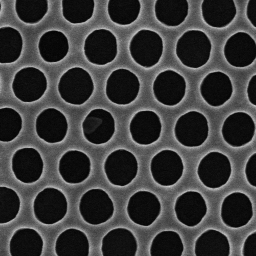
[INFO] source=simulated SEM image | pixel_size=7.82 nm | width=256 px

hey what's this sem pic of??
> a regular array of holes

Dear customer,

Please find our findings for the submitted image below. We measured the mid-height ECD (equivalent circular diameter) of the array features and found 266 nm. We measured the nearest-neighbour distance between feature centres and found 0.358 um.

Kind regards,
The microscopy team